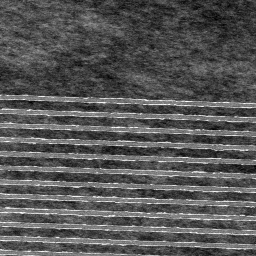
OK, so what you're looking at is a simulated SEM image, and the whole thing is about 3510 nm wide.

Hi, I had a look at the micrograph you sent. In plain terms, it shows parallel lines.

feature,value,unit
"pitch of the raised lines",193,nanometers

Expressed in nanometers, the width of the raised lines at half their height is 142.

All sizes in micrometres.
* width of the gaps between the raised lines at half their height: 0.0514